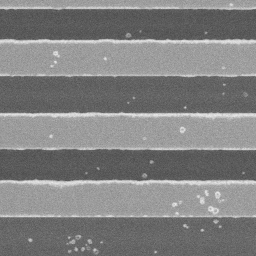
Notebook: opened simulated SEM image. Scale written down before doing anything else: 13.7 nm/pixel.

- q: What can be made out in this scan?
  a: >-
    lines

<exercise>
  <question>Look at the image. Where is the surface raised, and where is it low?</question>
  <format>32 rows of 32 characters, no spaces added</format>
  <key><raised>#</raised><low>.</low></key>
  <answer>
################################
................................
................................
................................
................................
################################
################################
################################
################################
........#.....#.......###...##..
................................
................................
................................
................................
################################
################################
################################
################################
################################
................................
................................
................................
....#.........#.................
################################
################################
################################
################################
................................
................................
................................
................................
................................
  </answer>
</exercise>